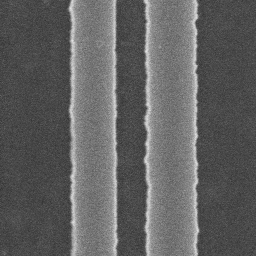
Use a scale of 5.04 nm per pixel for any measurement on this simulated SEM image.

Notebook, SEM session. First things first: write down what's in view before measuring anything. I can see lines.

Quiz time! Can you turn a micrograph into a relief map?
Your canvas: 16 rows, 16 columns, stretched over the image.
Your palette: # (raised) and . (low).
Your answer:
....###..###....
.....##..###....
....###..###....
....###..###....
....###..###....
....###..###....
....###..###....
....###..###....
....###..###....
....###..###....
.....##..###....
....###..###....
....###..###....
.....##..###....
.....##..###....
.....##..###....